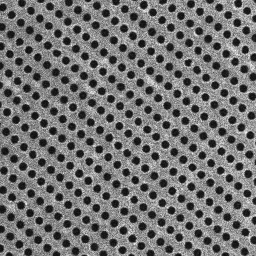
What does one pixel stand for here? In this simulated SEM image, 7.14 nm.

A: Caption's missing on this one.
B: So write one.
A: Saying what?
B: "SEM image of a regular array of holes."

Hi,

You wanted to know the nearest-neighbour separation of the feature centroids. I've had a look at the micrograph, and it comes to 0.0834 µm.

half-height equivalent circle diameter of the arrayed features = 0.0564 µm